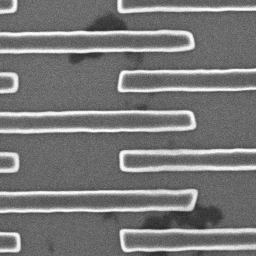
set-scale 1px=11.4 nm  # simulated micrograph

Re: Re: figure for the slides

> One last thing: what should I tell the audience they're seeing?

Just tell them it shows wiring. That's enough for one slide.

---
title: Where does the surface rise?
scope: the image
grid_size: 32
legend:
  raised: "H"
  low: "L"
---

HHLLLLLLLLLLLLLHHHHHHHHHHHHHHHHH
HLLLLLLLLLLLLLLLLLLLLLLLLLLLLLLL
LLLLLLLLLLLLLLLLLLLLLLLLLLLLLLLL
LLLLLLLLLLLLLLLLLLLLLLLLLLLLLLLL
HHHHHHHHHHHHHHHHHHHHHHHHLLLLLLLL
HHHHHHHHHHHHHHHHHHHHHHHHLLLLLLLL
LLLLLLLLLLLLLLLLLLLLLLLLLLLLLLLL
LLLLLLLLLLLLLLLLLLLLLLLLLLLLLLLL
LLLLLLLLLLLLLLLLLLLLLLLLLLLLLLLL
HHLLLLLLLLLLLLLHHHHHHHHHHHHHHHHH
HHLLLLLLLLLLLLLHHHHHHHHHHHHHHHHH
LLLLLLLLLLLLLLLLLLLLLLLLLLLLLLLL
LLLLLLLLLLLLLLLLLLLLLLLLLLLLLLLL
LLLLLLLLLLLLLLLLLLLLLLLLLLLLLLLL
HHHHHHHHHHHHHHHHHHHHHHHHLLLLLLLL
HHHHHHHHHHHHHHHHHHHHHHHHLLLLLLLL
LLLLLLLLLLLLLLLLLLLLLLLLLLLLLLLL
LLLLLLLLLLLLLLLLLLLLLLLLLLLLLLLL
LLLLLLLLLLLLLLLLLLLLLLLLLLLLLLLL
HHLLLLLLLLLLLLLHHHHHHHHHHHHHHHHH
HHLLLLLLLLLLLLLHHHHHHHHHHHHHHHHH
LLLLLLLLLLLLLLLLLLLLLLLLLLLLLLLL
LLLLLLLLLLLLLLLLLLLLLLLLLLLLLLLL
LLLLLLLLLLLLLLLLLLLLLLLLLLLLLLLL
HHHHHHHHHHHHHHHHHHHHHHHHLLLLLLLL
HHHHHHHHHHHHHHHHHHHHHHHHLLLLLLLL
LLLLLLLLLLLLLLLLLLLLLLLLLLLLLLLL
LLLLLLLLLLLLLLLLLLLLLLLLLLLLLLLL
LLLLLLLLLLLLLLLLLLLLLLLLLLLLLLLL
HHLLLLLLLLLLLLLHHHHHHHHHHHHHHHHH
HHLLLLLLLLLLLLLHHHHHHHHHHHHHHHHH
LLLLLLLLLLLLLLLLLLLLLLLLLLLLLLLL